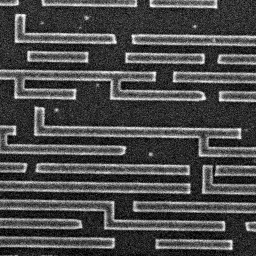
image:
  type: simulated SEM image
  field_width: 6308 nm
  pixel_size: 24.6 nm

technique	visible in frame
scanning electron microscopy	wiring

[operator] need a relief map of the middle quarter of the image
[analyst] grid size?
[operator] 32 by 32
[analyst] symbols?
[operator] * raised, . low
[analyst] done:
................................
................................
***********************....*****
***********************....*****
............**..................
............**..................
***.........***.................
***.........********************
***.........********************
................................
................................
................................
................................
................................
................................
................................
********************************
********************************
................................
................................
*...............................
***************.................
.......********.................
................................
................................
*******************************.
*******************************.
...........................****.
................................
................................
*******************************.
*******************************.